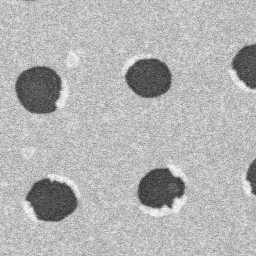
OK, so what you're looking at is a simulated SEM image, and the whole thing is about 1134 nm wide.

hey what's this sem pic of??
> holes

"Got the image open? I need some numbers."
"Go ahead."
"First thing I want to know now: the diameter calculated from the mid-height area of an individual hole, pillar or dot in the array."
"44.6 px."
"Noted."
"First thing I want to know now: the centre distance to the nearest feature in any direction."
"486 nanometers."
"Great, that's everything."